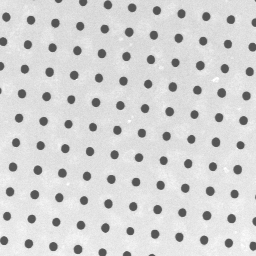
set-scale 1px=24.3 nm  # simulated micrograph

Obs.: a regular array of holes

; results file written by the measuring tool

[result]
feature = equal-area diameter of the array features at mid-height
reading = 0.209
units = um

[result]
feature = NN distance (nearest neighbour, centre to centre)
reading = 595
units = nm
